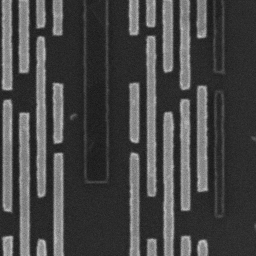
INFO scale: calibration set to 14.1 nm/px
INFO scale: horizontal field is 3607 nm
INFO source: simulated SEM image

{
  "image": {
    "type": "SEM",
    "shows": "wiring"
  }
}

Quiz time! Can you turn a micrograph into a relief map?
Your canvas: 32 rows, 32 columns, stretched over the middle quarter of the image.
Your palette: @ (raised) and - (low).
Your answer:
-----@@@@@@----------@@--@@--@@-
-----@@@@@@----------@@--@@--@@-
-----@@@@@@----------@@------@@-
-----@@@@@@----------@@------@@-
-----@@@@@@----------@@------@@-
-----@@@@@@------@@--@@------@@-
-----@@@@@@------@@--@@---------
-----@@@@@@------@@--@@---------
-----@@@@@@------@@--@@---------
-----@@@@@@------@@--@@------@@-
-----@@@@@@------@@--@@------@@-
-----@@@@@@------@@--@@------@@-
-----@@@@@@------@@--@@--@@--@@-
-----@@@@@@------@@--@@--@@--@@-
-----@@@@@@------@@--@@--@@--@@-
-----@@@@@@------@@--@@--@@--@@-
-----@@@@@@------@@--@@--@@--@@-
-----@@@@@@------@@--@@--@@--@@-
-----@@@@@@------@@--@@--@@--@@-
-----@@@@@@------@---@@--@@--@@-
-----@@@@@@----------@@--@@--@@-
-----@@@@@@----------@@--@@--@@-
-----@@@@@@------@---@@--@@--@@-
-----@@@@@@------@@--@@--@@--@@-
-----@@@@@@------@@--@@--@@--@@-
-----@@@@@@------@@--@@--@@--@@-
-----@@@@@@------@@--@@--@@--@@-
-----@@@@@@------@@--@@--@@--@@-
-----@@@@@@------@@--@@--@@--@@-
-----------------@@--@@--@@--@@-
-----------------@@--@@--@@--@@-
-----------------@@--@@--@@--@@-